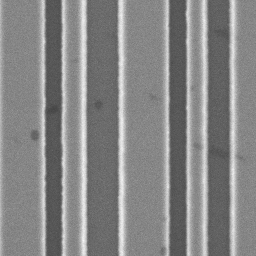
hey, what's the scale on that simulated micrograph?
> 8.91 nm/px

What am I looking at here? lines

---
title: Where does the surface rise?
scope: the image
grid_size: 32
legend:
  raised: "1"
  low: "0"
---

11111100110000011111100011000111
11111100110000011111100111000111
11111100110000011111100111000111
11111000110000011111100011000111
11111100110000011111100011000111
11111100110000011111100111000111
11111100110000011111100011000111
11111100110000011111100011000111
11111100110000011111100111000111
11111100110000011111100011000111
11111100110000011111100011000111
11111100110000011111100011000111
11111100110000011111100011000111
11111100110000011111100111000111
11111100110000011111100011000111
11111100110000011111100011000111
11111100110000011111100011000111
11111100110000011111100011000111
11111100110000011111100011000111
11111100110000011111100011000111
11111100110000011111100011000111
11111100110000011111100011000111
11111100110000011111100011000111
11111100110000011111100011000111
11111100110000011111100011000111
11111100110000011111100011000111
11111100110000011111100011000111
11111100110000011111100011000111
11111100110000011111100011000111
11111100110000011111100011000111
11111100110000011111100011000111
11111100110000011111100011000111